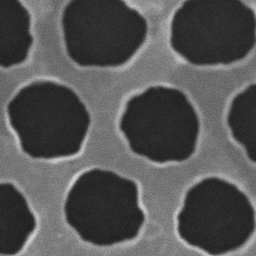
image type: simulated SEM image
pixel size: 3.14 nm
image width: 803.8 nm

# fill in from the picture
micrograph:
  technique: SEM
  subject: holes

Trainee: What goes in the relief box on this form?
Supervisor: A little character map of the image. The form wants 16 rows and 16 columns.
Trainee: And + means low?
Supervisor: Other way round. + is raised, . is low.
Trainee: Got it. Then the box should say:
..++....+++.....
..++.....++.....
..++.....++.....
..++....+++....+
++++++++++++++++
+...+++++..++++.
+....+++....+++.
+.....++....++..
+....+++....+++.
++...+++....+++.
++++++++++++++++
+++++...++++..++
..++.....+++....
..++.....++.....
..+++....++.....
.+++++++++++...+